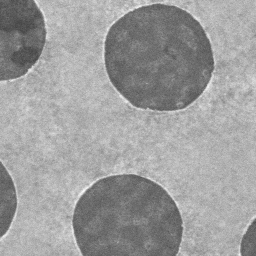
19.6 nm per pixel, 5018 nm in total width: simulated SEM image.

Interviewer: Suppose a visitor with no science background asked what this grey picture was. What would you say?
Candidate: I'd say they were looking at holes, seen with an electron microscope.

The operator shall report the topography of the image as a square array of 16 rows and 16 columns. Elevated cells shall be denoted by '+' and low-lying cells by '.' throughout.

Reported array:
..+++++++..+++++
...++++......+++
...++++......+++
...+++.......+++
..+++++......+++
+++++++......+++
++++++++....++++
++++++++++++++++
++++++++++++++++
++++++++++++++++
++++++++++++++++
.+++++....++++++
.++++......+++++
.++++......+++++
+++++......++++.
+++++......++++.